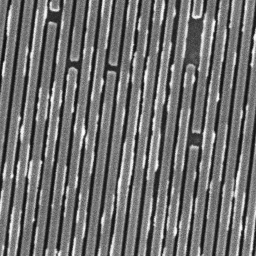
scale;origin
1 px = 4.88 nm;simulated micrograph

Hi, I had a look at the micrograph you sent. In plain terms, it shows parallel lines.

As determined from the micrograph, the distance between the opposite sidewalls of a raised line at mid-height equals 43.5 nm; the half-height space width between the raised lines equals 17.5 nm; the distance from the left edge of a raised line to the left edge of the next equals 63.1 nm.